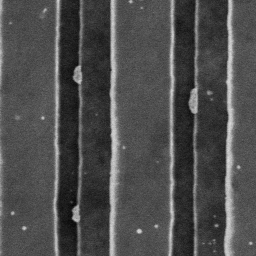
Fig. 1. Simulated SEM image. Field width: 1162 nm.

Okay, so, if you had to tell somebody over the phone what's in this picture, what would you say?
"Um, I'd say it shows lines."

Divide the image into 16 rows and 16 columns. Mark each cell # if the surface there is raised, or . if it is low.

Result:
####...####...##
####...####...##
####...####...##
####...####...##
####...####...##
####...####...##
####...####...##
####...####...##
####...####...##
####...####...##
####...####...##
####...####...##
###....####...##
###....####...##
####...####...##
####...####...##